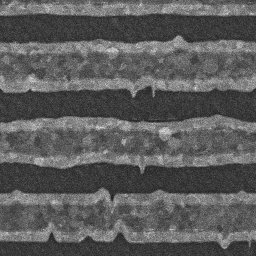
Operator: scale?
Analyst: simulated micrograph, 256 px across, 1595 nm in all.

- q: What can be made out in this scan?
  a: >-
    one or a few lines or trenches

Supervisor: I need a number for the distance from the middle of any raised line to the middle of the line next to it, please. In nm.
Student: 471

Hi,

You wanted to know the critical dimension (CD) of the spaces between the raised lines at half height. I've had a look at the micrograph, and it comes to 235 nm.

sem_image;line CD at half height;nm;235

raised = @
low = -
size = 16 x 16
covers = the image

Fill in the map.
@@@@@@@@@@@@@@@@
----------------
----------------
@@@@@@@@@@@@@@@@
@@@@@@@@@@@@@@@@
----------------
----------------
----------------
@@@@@@@@@@@@@@@@
@@@@@@@@@@@@@@@@
----------------
----------------
@@@@@@@@@@@@@@@@
@@@@@@@@@@@@@@@@
@@@@@@@-@@@@@@@@
----------------